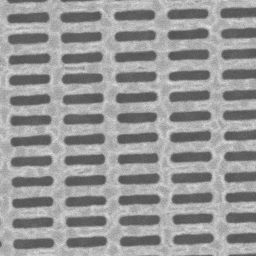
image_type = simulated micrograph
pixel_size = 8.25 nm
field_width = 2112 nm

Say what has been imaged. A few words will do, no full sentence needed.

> a regular array of holes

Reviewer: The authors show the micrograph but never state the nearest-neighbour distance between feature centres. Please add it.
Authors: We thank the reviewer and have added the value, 169 nm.